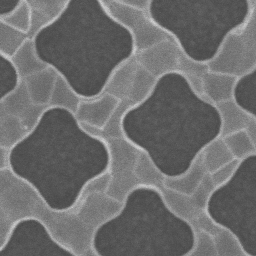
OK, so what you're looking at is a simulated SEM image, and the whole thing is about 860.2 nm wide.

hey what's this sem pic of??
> holes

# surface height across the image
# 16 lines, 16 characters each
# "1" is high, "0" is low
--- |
0111001110000001
1110000111000001
1100000011100011
1100000011110111
0111000111111111
0111101111001110
1111111110000110
1110011100000011
1100001100000111
1000000110001111
1000000111001110
1100011111111100
1110011100111000
1111111000011000
1001110000001100
0000110000001110